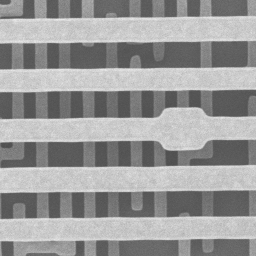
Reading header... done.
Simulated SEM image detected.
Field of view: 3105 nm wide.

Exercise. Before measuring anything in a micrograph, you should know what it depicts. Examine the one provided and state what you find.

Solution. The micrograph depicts wiring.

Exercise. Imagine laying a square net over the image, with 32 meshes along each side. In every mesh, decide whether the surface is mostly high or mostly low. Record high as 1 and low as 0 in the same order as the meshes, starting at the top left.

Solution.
00000000000000000000000000000000
00000000000000000000000000000000
11111111111111111111111111111111
11111111111111111111111111111111
11111111111111111111111111111111
00000000000000000000000000000000
00000000000000000000000000000000
00000000000000000000000000000000
00000000000000000000000000011111
11111111111111111111111111111111
11111111111111111111111111111111
00000000000000000000000000000000
00000000000000000000000000000000
00000000000000000000000010000000
00000000000000000000111111000000
11111111111111111111111111111111
11111111111111111111111111111111
11111111111111111111111111100000
00000000000000000000011110000000
00000000000000000000000000000000
00000000000000000000000000000000
11111111111111111111111111111111
11111111111111111111111111111111
11111111111111111111111111111111
00000000000000000000000000000000
00000000000000000000000000000000
00000000000000000000000000000000
11111111111111111111111111111111
11111111111111111111111111111111
11111111111111111111111111111111
00000000000000000000000000000000
00000000000000000000000000000000